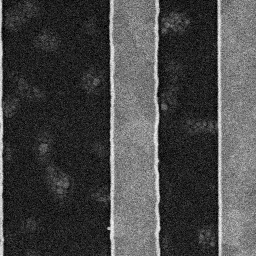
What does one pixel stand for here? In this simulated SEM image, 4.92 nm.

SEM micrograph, one or a few lines or trenches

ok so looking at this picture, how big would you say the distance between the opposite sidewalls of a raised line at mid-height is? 220 nm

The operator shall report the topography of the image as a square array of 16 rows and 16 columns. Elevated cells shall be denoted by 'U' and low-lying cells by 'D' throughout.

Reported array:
DDDDDDDUUUDDDDUU
DDDDDDDUUUDDDDUU
DDDDDDDUUUDDDDUU
DDDDDDDUUUDDDDUU
DDDDDDDUUUDDDDUU
DDDDDDDUUUDDDDUU
DDDDDDDUUUDDDDUU
DDDDDDDUUUDDDDUU
DDDDDDDUUUDDDDUU
DDDDDDDUUUDDDDUU
DDDDDDDUUUDDDDUU
DDDDDDDUUUDDDDUU
DDDDDDDUUUDDDDUU
DDDDDDDUUUDDDDUU
DDDDDDDUUUDDDDUU
DDDDDDDUUUDDDDUU